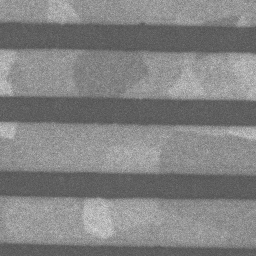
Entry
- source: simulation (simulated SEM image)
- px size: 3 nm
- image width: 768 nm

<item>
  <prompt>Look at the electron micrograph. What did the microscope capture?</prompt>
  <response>one or a few lines or trenches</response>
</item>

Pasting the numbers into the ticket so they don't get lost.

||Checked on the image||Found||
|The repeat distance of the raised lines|222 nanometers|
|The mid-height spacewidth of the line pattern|31.2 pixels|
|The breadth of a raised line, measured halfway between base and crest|0.128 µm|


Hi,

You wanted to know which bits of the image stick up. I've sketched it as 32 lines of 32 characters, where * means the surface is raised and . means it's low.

********************************
********************************
....**.*************************
................................
................................
................................
*.*****.........................
********************************
********************************
********************************
********************************
********************************
................................
................................
................................
................................
********************************
********************************
********************************
********************************
********************************
................................
................................
................................
................................
********************************
********************************
********************************
********************************
********************************
....................****.*******
................................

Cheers